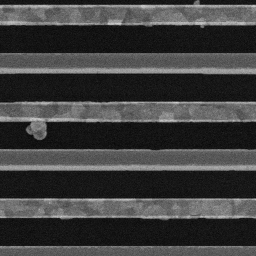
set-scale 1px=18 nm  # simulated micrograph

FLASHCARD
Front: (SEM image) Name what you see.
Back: lines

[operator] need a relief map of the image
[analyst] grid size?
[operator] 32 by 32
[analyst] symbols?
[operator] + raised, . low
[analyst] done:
................................
++++++++++++++++++++++++++++++++
++++++++++++++++++++++++++++++++
................................
................................
................................
................................
++++++++++++++++++++++++++++++++
++++++++++++++++++++++++++++++++
................................
................................
................................
................................
++++++++++++++++++++++++++++++++
++++++++++++++++++++++++++++++++
................................
................................
................................
................................
++++++++++++++++++++++++++++++++
++++++++++++++++++++++++++++++++
................................
................................
................................
................................
++++++++++++++++++++++++++++++++
++++++++++++++++++++++++++++++++
................................
................................
................................
................................
++++++++++++++++++++++++++++++++